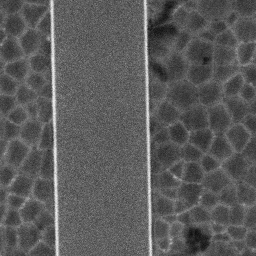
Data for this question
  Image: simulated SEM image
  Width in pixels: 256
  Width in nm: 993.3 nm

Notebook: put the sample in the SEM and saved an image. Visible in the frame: one or a few lines or trenches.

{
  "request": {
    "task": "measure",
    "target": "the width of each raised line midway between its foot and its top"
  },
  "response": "363 nm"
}